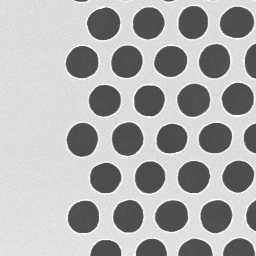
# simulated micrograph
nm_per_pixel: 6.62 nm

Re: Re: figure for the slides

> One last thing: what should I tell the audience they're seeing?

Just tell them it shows a regular array of holes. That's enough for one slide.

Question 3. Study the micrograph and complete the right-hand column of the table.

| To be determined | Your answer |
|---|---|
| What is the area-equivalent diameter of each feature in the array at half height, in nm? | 214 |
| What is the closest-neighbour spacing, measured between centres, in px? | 44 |